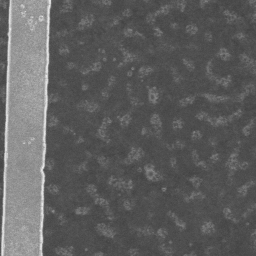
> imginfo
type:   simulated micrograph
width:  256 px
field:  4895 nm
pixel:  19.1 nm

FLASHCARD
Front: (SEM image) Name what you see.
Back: one or a few lines or trenches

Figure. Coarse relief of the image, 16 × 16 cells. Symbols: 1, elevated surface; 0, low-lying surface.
0110000000000000
0110000000000000
0110000000000000
0110000000000000
0110000000000000
0110000000000000
1110000000000000
1110000000000000
1110000000000000
1110000000000000
1110000000000000
1110000000000000
1110000000000000
1110000000000000
1110000000000000
1110000000000000